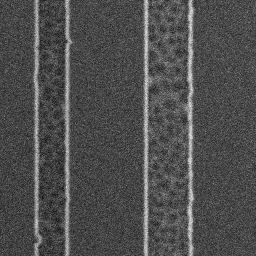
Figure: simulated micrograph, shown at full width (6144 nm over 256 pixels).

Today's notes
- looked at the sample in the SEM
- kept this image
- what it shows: one or a few lines or trenches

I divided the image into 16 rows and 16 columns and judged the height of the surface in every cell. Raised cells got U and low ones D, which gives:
UUDDUUUUUDDDUUUU
UUDDUUUUUDDDUUUU
UUDDUUUUUDDDUUUU
UUDDUUUUUDDDUUUU
UUDDUUUUUDDDUUUU
UUDDUUUUUDDDUUUU
UUDDUUUUUDDDUUUU
UUDDUUUUUDDDUUUU
UUDDUUUUUDDDUUUU
UUDDUUUUUDDDUUUU
UUDDUUUUUDDDUUUU
UUDDUUUUUDDDUUUU
UUDDUUUUUDDDUUUU
UUDDUUUUUDDDUUUU
UUDDUUUUUDDDUUUU
UUDDUUUUUDDDUUUU